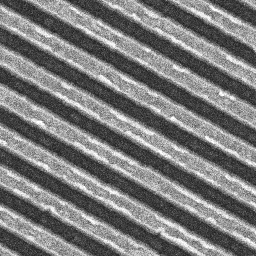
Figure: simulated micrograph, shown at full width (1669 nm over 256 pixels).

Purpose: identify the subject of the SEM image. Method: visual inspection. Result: parallel lines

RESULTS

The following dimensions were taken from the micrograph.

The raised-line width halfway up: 116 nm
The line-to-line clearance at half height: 110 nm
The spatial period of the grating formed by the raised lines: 227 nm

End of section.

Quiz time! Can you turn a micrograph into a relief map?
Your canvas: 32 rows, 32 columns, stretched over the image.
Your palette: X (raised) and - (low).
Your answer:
----XXXXX----XXXXX----XXXX-----X
XX----XXXXX----XXXX-----XXXX----
XXX-----XXXX-----XXXX-----XXXX--
-XXXX-----XXXX----XXXXX----XXXXX
---XXXX----XXXXX----XXXXX----XXX
----XXXXX----XXXXX----XXXX-----X
XX----XXXXX----XXXX-----XXXX----
XXX-----XXXX-----XXXX-----XXXX--
-XXXX-----XXXX-----XXXX----XXXXX
--XXXXX----XXXXX----XXXXX----XXX
----XXXXX----XXXXX----XXXX-----X
XX----XXXX-----XXXX-----XXXX----
XXX-----XXXX-----XXXX-----XXXX--
-XXXX-----XXXX-----XXXX----XXXXX
--XXXXX----XXXXX----XXXXX----XXX
----XXXXX----XXXXX----XXXXX----X
XX----XXXX-----XXXXX----XXXX----
XXX-----XXXX-----XXXX-----XXXX--
-XXXX-----XXXX-----XXXX----XXXXX
---XXXX----XXXXX----XXXXX----XXX
----XXXXX----XXXX-----XXXX-----X
XX----XXXXX----XXXXX----XXXX----
XXX-----XXXX-----XXXX-----XXXX--
-XXXX-----XXXX-----XXXX----XXXXX
--XXXXX----XXXXX----XXXXX----XXX
----XXXXX----XXXXX----XXXX-----X
XX----XXXX-----XXXX-----XXXX----
XXX-----XXXX-----XXXX----XXXXX--
-XXXX-----XXXX----XXXXX----XXXXX
---XXXX-----XXXX----XXXXX----XXX
----XXXXX----XXXXX----XXXX-----X
XX----XXXX-----XXXX-----XXXX----